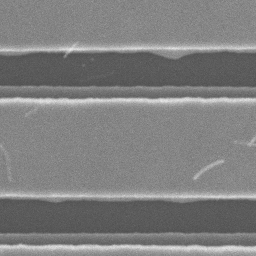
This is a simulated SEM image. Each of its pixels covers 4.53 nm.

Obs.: lines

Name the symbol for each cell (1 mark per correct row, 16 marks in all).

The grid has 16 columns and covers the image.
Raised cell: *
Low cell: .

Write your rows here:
****************
****************
****************
................
................
................
****************
****************
****************
****************
****************
****************
................
................
................
****************